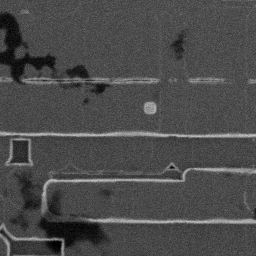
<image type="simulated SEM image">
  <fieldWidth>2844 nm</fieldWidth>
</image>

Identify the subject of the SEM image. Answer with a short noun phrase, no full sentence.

wiring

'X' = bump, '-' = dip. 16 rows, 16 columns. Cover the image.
XXXXXXXXXXXXXXXX
XXXXXXXXXXXXXXXX
XXXXXXXXXXXXXXXX
XXXXXXXXXXXXXXXX
XXXXXXXXXXXXXXXX
XXXXXXXXXXXXXXXX
XXXXXXXXXXXXXXXX
XXXXXXXXXXXXXXXX
-----------XXX--
----------------
----------------
---XXXXXXXXXXXXX
---XXXXXXXXXXXXX
---XXXXXXXXXXXXX
----------------
----------------